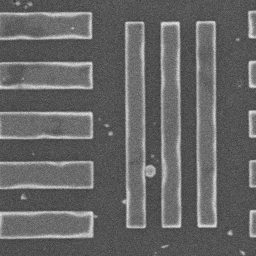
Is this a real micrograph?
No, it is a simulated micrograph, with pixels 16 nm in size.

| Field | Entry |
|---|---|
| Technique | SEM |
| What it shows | groups of lines, slits or small figures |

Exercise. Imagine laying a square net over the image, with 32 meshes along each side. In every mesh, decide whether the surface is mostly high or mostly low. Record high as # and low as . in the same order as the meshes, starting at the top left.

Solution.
................................
...............................#
###########....................#
###########.....##..##...##....#
###########.....##..##...##....#
................##..##...##.....
................##..##...##.....
................##..##...##.....
###########.....##..##...##....#
###########.....##..##...##....#
############....##..##...##....#
................##..##...##.....
................##..##...##.....
................##..##...##.....
###########.....##..##...##....#
############....##..###..##....#
############....##..###..##....#
................##..##...##.....
................##..##...##.....
................##..##...##.....
############....##..##...##....#
############....###.###..##....#
############....##..###..##....#
##.......##.....##..###..##.....
................##..##...##.....
................##..###..##.....
................##..###..##.....
############....##..###..##....#
############...................#
##########......................
................................
................................